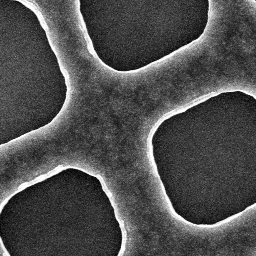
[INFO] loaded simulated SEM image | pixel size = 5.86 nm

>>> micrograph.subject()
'holes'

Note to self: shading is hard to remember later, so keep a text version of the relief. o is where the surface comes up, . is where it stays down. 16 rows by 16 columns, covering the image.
..ooo........ooo
...oo........ooo
...ooo......oooo
...ooo....oooooo
....oooooooooooo
....oooooooooooo
....oooooooo....
...ooooooo......
.ooooooooo......
ooooooooo.......
oooooooooo......
oo....oooo......
o......oooo.....
.......oooo....o
........oooooooo
........oooooooo